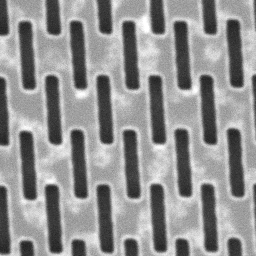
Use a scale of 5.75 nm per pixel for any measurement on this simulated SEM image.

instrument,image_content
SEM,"a regular array of holes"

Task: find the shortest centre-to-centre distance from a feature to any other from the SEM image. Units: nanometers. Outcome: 296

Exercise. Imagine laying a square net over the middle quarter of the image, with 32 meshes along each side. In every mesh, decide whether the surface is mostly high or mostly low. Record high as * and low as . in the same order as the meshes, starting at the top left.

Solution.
**....*********....*********....
**....*********....*********....
**....*********....***.*****....
**....**....***....**...****....
**....**....***....**....***....
**....**....***....**....***....
****.***....****...**....****...
********....*********....*******
********....*********....*******
********....*********....*******
********....*********....*******
********....*********....*******
********....*********....*******
*********...*********....*******
*********...*********....*******
*********....*********...*******
**...****....**...****....*....*
*....****....*....****....*....*
*....****....**...****....*....*
**...****...***...****....*.....
**...**********....********.....
**...**********....*********....
**....*********....*********....
**....*********....*********....
**....*********....*********....
**....*********....*********....
**....*********....*********....
**....*********....*********....
**....*********....*********....
**....*********....*********....
**....**....***....**....***....
**....**....***....**....***....